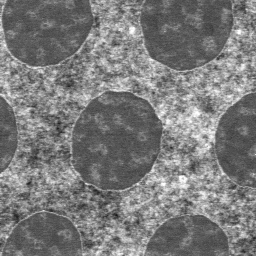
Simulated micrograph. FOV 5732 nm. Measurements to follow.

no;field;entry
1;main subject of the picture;raised bodies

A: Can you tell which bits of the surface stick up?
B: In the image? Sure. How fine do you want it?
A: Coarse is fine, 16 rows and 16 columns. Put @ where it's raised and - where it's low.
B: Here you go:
@@@@@@---@@@@@--
@@@@@@---@@@@@@-
@@@@@----@@@@@--
-@@@-----@@@@@--
----------------
----------------
@----@@@@------@
@----@@@@@----@@
@---@@@@@@---@@@
@---@@@@@@---@@@
-----@@@@-----@@
------@@-------@
----------------
--@@-------@@---
-@@@@-----@@@@--
@@@@@----@@@@@--